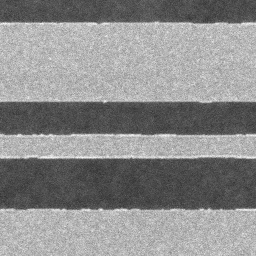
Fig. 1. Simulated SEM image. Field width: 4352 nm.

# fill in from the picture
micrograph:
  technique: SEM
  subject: lines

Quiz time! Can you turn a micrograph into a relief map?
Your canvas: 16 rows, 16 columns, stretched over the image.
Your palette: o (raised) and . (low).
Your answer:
................
oooooooooooo.ooo
oooooooooooooooo
oooooooooooooooo
oooooooooooooooo
oooooooooooooooo
................
................
oooooooooooooooo
oooooooooooooooo
................
................
................
oooooooooooooooo
oooooooooooooooo
oooooooooooooooo